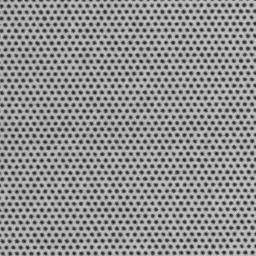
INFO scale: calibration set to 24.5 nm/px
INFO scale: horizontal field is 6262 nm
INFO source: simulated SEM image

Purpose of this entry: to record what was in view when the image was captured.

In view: a regular array of holes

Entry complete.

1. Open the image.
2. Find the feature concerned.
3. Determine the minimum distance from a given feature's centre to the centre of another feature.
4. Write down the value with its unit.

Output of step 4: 164 nm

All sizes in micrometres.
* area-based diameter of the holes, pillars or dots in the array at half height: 0.103